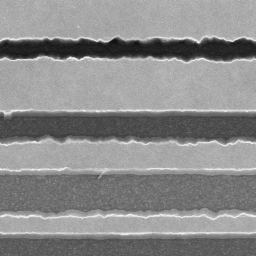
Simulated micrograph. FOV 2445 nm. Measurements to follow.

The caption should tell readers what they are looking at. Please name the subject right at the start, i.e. one or a few lines or trenches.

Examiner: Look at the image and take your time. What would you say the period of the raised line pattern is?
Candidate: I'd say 667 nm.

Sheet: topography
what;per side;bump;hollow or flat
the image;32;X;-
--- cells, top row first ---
XXXXXXXXXXXXXXXXXXXXXXXXXXXXXXXX
XXXXXXXXXXXXXXXXXXXXXXXXXXXXXXXX
XXXXXXXXXXXXXXXXXXXXXXXXXXXXXXXX
XXXXXXXXXXXXXXXXXXXXXXXXXXXXXXXX
XXXXXXXXXXXXXXXXXXXXXXXXXXXXXXXX
--------------------------------
--------------------------------
XXXXXXXXXXXXXXXXXXXXXXXXXXXXXXXX
XXXXXXXXXXXXXXXXXXXXXXXXXXXXXXXX
XXXXXXXXXXXXXXXXXXXXXXXXXXXXXXXX
XXXXXXXXXXXXXXXXXXXXXXXXXXXXXXXX
XXXXXXXXXXXXXXXXXXXXXXXXXXXXXXXX
XXXXXXXXXXXXXXXXXXXXXXXXXXXXXXXX
XXXXXXXXXXXXXXXXXXXXXXXXXXXXXXXX
--------------------------------
--------------------------------
--------------------------------
---X-XX-XXX--XX-X----X-------XX-
XXXXXXXXXXXXXXXXXXXXXXXXXXXXXXXX
XXXXXXXXXXXXXXXXXXXXXXXXXXXXXXXX
XXXXXXXXXXXXXXXXXXXXXXXXXXXXXXXX
XXXXXXXX----X----------------X--
--------------------------------
--------------------------------
--------------------------------
--------------------------------
-------------------------X------
XXXXXXXXXXXXXXXXXXXXXXXXXXXXXXXX
XXXXXXXXXXXXXXXXXXXXXXXXXXXXXXXX
---------X--X--XXX----XX--------
--------------------------------
--------------------------------